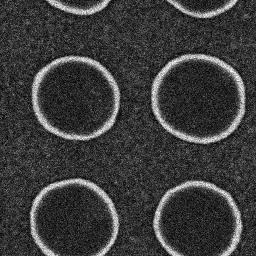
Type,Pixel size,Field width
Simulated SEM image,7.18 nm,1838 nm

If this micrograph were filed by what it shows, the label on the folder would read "raised bodies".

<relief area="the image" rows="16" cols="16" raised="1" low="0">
0000110000011100
0000000000000000
0000000000000000
0000000000000000
0001111000111110
0011111000111110
0011111000111110
0001111000111110
0000110000011100
0000000000000000
0000000000000000
0000110000001000
0011111000111100
0011111000111110
0011111000111110
0001111000111100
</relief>